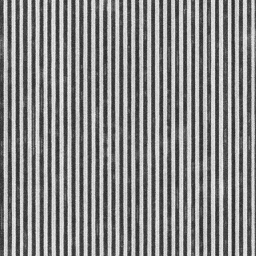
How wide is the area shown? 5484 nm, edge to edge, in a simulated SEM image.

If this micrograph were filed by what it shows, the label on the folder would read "parallel lines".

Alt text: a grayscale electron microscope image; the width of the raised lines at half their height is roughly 3.62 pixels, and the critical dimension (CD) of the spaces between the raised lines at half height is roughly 99.1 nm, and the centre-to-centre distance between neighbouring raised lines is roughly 0.171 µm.